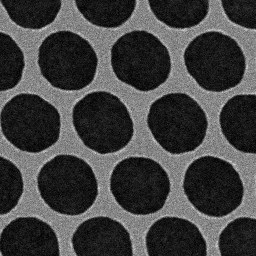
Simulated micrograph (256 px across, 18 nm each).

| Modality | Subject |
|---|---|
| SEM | a regular array of holes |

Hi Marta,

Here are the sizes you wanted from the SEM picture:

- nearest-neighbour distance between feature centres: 1300 nm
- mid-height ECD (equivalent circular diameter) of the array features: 1.09 um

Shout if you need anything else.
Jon